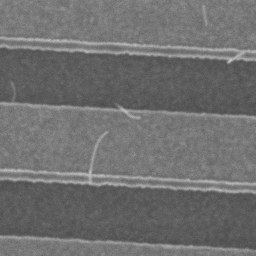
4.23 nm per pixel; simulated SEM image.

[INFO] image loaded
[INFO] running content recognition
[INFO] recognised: lines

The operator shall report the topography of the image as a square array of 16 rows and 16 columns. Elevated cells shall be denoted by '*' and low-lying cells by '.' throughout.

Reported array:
****************
****************
****************
..........******
................
................
*...............
****************
****************
****************
****************
.....***********
................
................
................
**************..